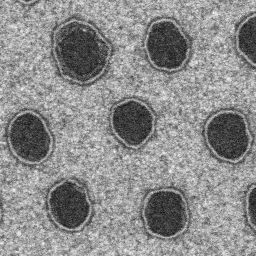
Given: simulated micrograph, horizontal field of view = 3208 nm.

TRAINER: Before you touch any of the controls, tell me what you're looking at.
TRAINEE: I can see raised bodies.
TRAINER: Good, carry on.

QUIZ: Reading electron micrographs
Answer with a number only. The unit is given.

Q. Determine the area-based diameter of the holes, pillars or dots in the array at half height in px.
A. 46.4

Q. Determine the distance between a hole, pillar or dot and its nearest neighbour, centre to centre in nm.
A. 1060